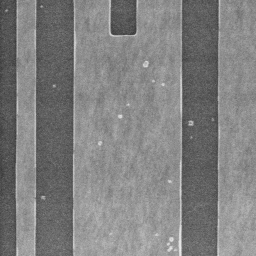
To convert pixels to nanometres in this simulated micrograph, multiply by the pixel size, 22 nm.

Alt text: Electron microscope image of groups of lines, slits or small figures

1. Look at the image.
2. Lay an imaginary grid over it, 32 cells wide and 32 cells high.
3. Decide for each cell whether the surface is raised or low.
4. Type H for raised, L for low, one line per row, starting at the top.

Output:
LLHHLLLLLHHHHHLLLHHHHHHLLLLHHHHH
LLHHLLLLLHHHHHLLLHHHHHHLLLLHHHHH
LLHHLLLLLHHHHHLLLHHHHHHLLLLHHHHH
LLHHLLLLLHHHHHLLLHHHHHHLLLLHHHHH
LLHHLLLLLHHHHHHHHHHHHHHLLLLHHHHH
LLHHLLLLLHHHHHHHHHHHHHHLLLLHHHHH
LLHHLLLLLHHHHHHHHHHHHHHLLLLHHHHH
LLHHLLLLLHHHHHHHHHHHHHHLLLLHHHHH
LLHHLLLLLHHHHHHHHHHHHHHLLLLHHHHH
LLHHLLLLLHHHHHHHHHHHHHHLLLLHHHHH
LLHHLLLLLHHHHHHHHHHHHHHLLLLHHHHH
LLHHLLLLLHHHHHHHHHHHHHHLLLLHHHHH
LLHHLLLLLHHHHHHHHHHHHHHLLLLHHHHH
LLHHLLLLLHHHHHHHHHHHHHHLLLLHHHHH
LLHHLLLLLHHHHHHHHHHHHHHLLLLHHHHH
LLHHLLLLLHHHHHHHHHHHHHHLLLLHHHHH
LLHHLLLLLHHHHHHHHHHHHHHLLLLHHHHH
LLHHLLLLLHHHHHHHHHHHHHHLLLLHHHHH
LLHHLLLLLHHHHHHHHHHHHHHLLLLHHHHH
LLHHLLLLLHHHHHHHHHHHHHHLLLLHHHHH
LLHHLLLLLHHHHHHHHHHHHHHLLLLHHHHH
LLHHLLLLLHHHHHHHHHHHHHHLLLLHHHHH
LLHHLLLLLHHHHHHHHHHHHHHLLLLHHHHH
LLHHLLLLLHHHHHHHHHHHHHHLLLLHHHHH
LLHHLLLLLHHHHHHHHHHHHHHLLLLHHHHH
LLHHLLLLLHHHHHHHHHHHHHHLLLLHHHHH
LLHHLLLLLHHHHHHHHHHHHHHLLLLHHHHH
LLHHLLLLLHHHHHHHHHHHHHHLLLLHHHHH
LLHHLLLLLHHHHHHHHHHHHHHLLLLHHHHH
LLHHLLLLLHHHHHHHHHHHHHLLLLLHHHHH
LLHHLLLLLHHHHHHHHHHHHHLLLLLHHHHH
LLHHLLLLLHHHHHHHHHHHHHLLLLLHHHHH